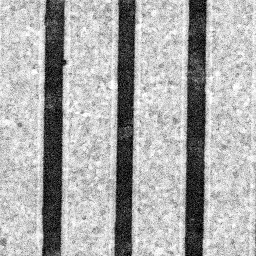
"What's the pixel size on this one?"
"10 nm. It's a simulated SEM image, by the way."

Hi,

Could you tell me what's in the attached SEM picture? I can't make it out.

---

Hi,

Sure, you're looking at one or a few lines or trenches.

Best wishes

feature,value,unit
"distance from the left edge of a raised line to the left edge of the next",706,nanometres